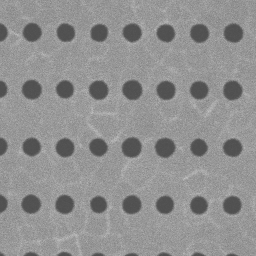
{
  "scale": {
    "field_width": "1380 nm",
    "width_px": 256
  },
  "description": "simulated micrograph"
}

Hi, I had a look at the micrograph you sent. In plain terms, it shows a regular array of holes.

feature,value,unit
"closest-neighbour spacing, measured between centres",180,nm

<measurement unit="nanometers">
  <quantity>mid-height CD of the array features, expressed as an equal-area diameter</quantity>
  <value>102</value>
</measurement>